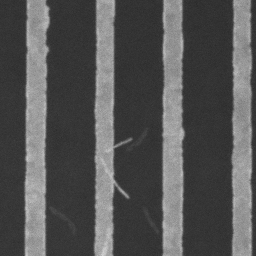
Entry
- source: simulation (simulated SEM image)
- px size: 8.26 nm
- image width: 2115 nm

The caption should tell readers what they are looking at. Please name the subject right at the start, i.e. lines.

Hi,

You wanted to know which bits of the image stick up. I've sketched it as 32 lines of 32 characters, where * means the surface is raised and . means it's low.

....**......**.......**......**.
....**......**.......**......**.
...***......**.......**......**.
...***......**.......**......**.
...***......**.......**......**.
...***......**.......**......**.
....**......**.......**......**.
...***......**.......**......**.
...***......**.......**......**.
...***......**.......**......**.
...***......**.......**......**.
...***......**.......**......**.
...***......**.......**......**.
...***......**.......**......**.
...***......**.......**......**.
...***......**.......**......**.
...***......**.......**......**.
...***......**.......**......**.
...***......**.......**......**.
...***......**.......**......**.
...***......**.......**......**.
...***......**.......**......**.
...***......**.......**......**.
...***......**.......**......**.
...***......**.......**......**.
...***......**......***......**.
...***......**.......**......**.
...***......**.......**......**.
...***......**......***......**.
...***......**.......**......**.
...***......**.......**......**.
...***......**.......**......**.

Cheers